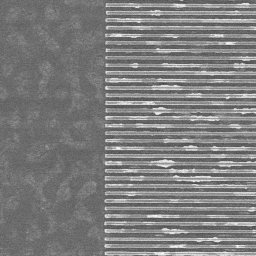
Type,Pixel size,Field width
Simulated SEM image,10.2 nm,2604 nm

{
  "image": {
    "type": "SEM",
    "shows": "parallel lines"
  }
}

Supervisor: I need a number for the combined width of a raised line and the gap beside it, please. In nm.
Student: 75.8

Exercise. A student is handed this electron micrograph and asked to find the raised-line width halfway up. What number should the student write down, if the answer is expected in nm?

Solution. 30.5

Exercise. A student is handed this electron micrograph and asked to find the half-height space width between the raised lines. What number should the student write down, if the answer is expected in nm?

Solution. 45.8